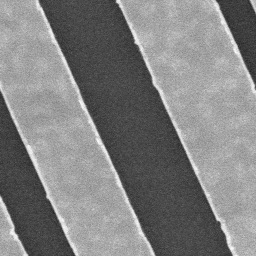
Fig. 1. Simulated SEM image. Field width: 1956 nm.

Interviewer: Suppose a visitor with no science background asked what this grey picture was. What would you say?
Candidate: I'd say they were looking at one or a few lines or trenches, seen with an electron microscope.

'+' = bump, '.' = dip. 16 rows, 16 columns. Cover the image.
+++.....++++++..
+++.....++++++..
+++.....+++++++.
++++.....++++++.
++++.....++++++.
+++++.....++++++
+++++.....++++++
.+++++.....+++++
.+++++.....+++++
..+++++.....++++
..+++++.....++++
...+++++.....+++
...+++++.....+++
+...++++......++
+...+++++.....++
+....++++.....++